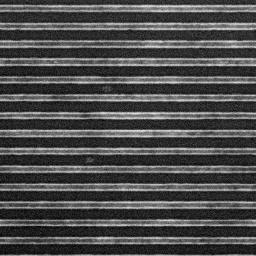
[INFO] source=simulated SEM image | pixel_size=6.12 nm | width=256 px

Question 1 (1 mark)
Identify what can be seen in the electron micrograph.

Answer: parallel lines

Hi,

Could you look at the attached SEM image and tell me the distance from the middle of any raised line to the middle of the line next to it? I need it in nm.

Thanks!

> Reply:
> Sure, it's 109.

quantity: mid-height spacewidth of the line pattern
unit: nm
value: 72.7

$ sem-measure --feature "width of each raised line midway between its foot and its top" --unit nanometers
36